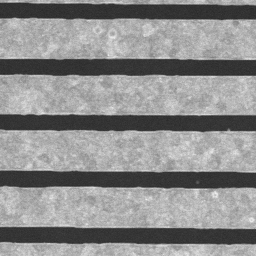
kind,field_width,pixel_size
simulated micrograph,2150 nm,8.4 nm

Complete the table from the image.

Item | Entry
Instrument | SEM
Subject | lines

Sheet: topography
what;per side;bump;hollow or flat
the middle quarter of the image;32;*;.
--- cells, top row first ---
................................
................................
................................
********************************
********************************
********************************
********************************
********************************
********************************
********************************
********************************
********************************
..........*****..***********.***
................................
................................
................................
................................
********************************
********************************
********************************
********************************
********************************
********************************
********************************
********************************
********************************
********************************
................................
................................
................................
................................
********************************